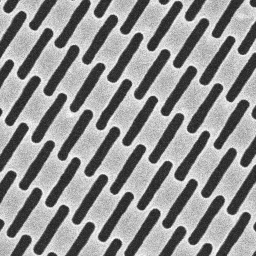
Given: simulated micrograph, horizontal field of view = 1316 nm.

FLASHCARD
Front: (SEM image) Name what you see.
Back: a regular array of holes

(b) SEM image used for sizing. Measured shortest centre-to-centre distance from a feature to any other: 161 nanometers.